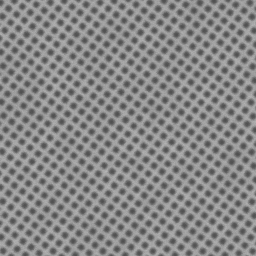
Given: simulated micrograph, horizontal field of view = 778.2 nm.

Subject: a regular array of holes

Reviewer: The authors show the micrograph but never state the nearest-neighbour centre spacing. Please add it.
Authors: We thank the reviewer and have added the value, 9.8 px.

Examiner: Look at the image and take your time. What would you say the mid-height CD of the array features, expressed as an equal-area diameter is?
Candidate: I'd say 21.4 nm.